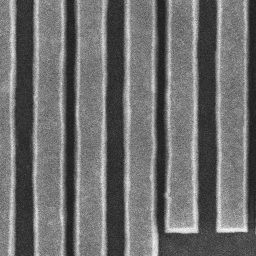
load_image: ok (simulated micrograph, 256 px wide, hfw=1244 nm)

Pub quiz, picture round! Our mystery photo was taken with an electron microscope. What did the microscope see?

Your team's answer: parallel lines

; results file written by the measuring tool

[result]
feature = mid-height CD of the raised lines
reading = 0.145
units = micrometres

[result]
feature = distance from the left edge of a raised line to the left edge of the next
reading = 0.222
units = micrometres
